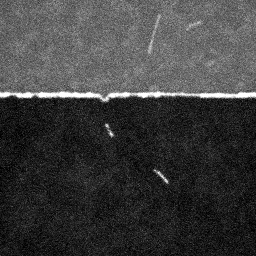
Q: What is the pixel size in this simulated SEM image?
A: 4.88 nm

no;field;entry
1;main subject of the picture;one or a few lines or trenches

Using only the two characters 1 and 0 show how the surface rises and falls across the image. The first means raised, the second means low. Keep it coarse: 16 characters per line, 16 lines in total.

0000000000000000
0000000000000000
0000000000000000
0000000000000000
0000000000000000
0000000000000000
1111111111111111
1111111111111111
1111111111111111
1111111111111111
1111111111111111
1111111111111111
1111111111111111
1111111111111111
1111111111111111
1111111111111111